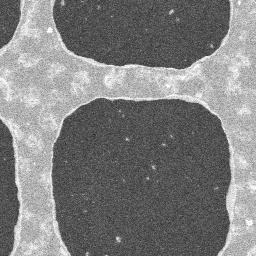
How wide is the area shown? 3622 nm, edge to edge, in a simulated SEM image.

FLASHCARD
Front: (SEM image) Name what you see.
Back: holes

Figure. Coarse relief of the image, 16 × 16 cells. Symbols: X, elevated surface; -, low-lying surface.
-XX-----------XX
-XX-----------XX
-XXX----------XX
XXXXX--------XXX
XXXXXXXXXXXXXXXX
XXXXXXXXXXXXXXXX
XXXXX--------XXX
XXXX----------XX
-XXX----------XX
-XX-----------XX
-XX------------X
-XX------------X
-XX-----------XX
-XX-----------XX
-XXX----------XX
-XXX----------XX